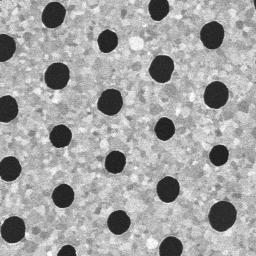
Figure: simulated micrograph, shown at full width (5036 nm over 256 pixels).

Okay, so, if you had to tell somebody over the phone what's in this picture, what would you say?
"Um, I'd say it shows a regular array of holes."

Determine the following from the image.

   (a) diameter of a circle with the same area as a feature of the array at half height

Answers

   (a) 493 nm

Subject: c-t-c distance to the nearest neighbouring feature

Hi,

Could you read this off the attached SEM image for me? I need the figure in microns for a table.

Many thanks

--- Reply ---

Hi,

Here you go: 1.17